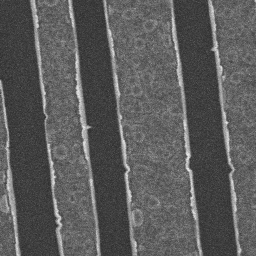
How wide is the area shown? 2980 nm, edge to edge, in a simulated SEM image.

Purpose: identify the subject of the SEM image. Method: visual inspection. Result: one or a few lines or trenches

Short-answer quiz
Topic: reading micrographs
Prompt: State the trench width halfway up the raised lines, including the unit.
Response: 431 nanometres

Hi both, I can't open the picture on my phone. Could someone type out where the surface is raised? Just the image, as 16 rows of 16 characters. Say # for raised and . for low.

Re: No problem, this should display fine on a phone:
..###..####..###
..###..####..###
..###..####..###
..###..####...##
...##..####...##
...##..####...##
...##..#####..##
...##..#####..##
#..##...####..##
#..##...####..##
#..###..####..##
#..###..####..##
#..###..####...#
#...##..####...#
#...##..####...#
#...##..#####..#